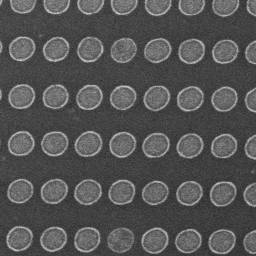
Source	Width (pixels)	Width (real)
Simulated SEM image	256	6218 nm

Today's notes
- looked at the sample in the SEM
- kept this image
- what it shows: a regular array of raised bodies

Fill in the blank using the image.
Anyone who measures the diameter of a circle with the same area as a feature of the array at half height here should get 0.594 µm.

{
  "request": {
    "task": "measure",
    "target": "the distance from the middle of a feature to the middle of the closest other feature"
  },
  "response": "814 nanometers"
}